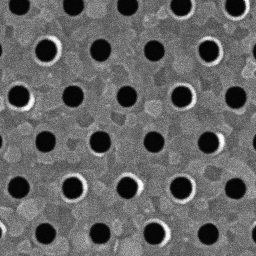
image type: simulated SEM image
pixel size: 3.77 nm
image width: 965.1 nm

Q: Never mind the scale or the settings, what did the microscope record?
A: a regular array of holes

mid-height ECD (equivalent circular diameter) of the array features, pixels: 21.8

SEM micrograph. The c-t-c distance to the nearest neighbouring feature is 52.9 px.